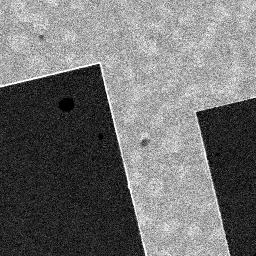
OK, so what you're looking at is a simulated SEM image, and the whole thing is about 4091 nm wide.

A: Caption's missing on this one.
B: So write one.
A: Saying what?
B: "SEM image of one or a few lines or trenches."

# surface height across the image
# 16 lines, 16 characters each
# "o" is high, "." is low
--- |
oooooooooooooooo
oooooooooooooooo
oooooooooooooooo
oooooooooooooooo
oooo..oooooooooo
.......ooooooooo
.......ooooooo..
.......ooooo....
.......oooooo...
........ooooo...
........ooooo...
........ooooo...
........oooooo..
.........ooooo..
.........ooooo..
.........ooooo..